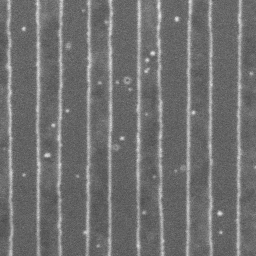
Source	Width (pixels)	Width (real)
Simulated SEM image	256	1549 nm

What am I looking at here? lines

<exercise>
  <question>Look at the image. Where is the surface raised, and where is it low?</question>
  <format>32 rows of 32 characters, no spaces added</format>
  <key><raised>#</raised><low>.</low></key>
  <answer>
#....###...###...###....##....##
#....###...###...###....##....##
#....###...###...###....##....##
#....###...###...###....##....##
#....###...###...###....##....##
#....###...###...###....##....##
#....###...###...###....##....##
#....###...###...###....##....##
#....###...###...###...###....##
#....###...###...###...###....##
#....###...###...###....##....##
#....###...###...###....##....##
#....###...###...###....##....##
#....###...###...###...###....##
#....###...###...###...###....##
#....##....###...###...###....##
#....##....###...###...###....##
#....##....###...###...###....##
#....###...###...###...###....##
#....##....###...###...###....##
#....##....###...###...###....##
#....##....###...###...###....##
#....##....###...###...###....##
#....##....###...###...###....##
#....##....###...###...###....##
#....###...###...###...###....##
##...###...###...###...###....##
#....###...###...###...###....##
##...###...###...###...###....##
##...###...###...###...###....##
#....###...###...###...###....##
#....###...###...###...###....##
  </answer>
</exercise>